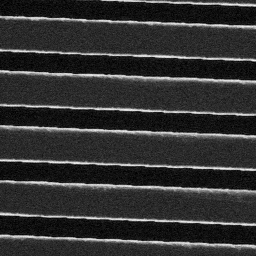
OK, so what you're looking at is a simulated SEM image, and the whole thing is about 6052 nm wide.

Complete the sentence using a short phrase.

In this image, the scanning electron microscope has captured lines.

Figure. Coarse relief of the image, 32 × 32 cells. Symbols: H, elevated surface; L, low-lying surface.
LLLLLLLLLLLLLLLLLLLLLLLLLLLLHHHH
LLLLLLLLLLLLLLLLLLLLLLLLLLLLLLLL
HHHHHHHHHHHLLLLLLLLLLLLLLLLLLLLL
HHHHHHHHHHHHHHHHHHHHHHHHHHHHHHHH
HHHHHHHHHHHHHHHHHHHHHHHHHHHHHHHH
HHHHHHHHHHHHHHHHHHHHHHHHHHHHHHHH
LLLLLHHHHHHHHHHHHHHHHHHHHHHHHHHH
LLLLLLLLLLLLLLLLLLLLLLLLLLLLLLLL
LLLLLLLLLLLLLLLLLLLLLLLLLLLLLLLL
HHHHHHHHHHHHHHHLLLLLLLLLLLLLLLLL
HHHHHHHHHHHHHHHHHHHHHHHHHHHHHHHH
HHHHHHHHHHHHHHHHHHHHHHHHHHHHHHHH
HHHHHHHHHHHHHHHHHHHHHHHHHHHHHHHH
LLLLLLLLLHHHHHHHHHHHHHHHHHHHHHHH
LLLLLLLLLLLLLLLLLLLLLLLLLLLLLLLL
LLLLLLLLLLLLLLLLLLLLLLLLLLLLLLLL
HHHHHHHHHHHHHHHHHHLLLLLLLLLLLLLL
HHHHHHHHHHHHHHHHHHHHHHHHHHHHHHHH
HHHHHHHHHHHHHHHHHHHHHHHHHHHHHHHH
HHHHHHHHHHHHHHHHHHHHHHHHHHHHHHHH
LLLLLLLLLLLLLHHHHHHHHHHHHHHHHHHH
LLLLLLLLLLLLLLLLLLLLLLLLLLLLLLLL
LLLLLLLLLLLLLLLLLLLLLLLLLLLLLLLL
HHHHHHHHHHHHHHHHHHHHHLLLLLLLLLLL
HHHHHHHHHHHHHHHHHHHHHHHHHHHHHHHH
HHHHHHHHHHHHHHHHHHHHHHHHHHHHHHHH
HHHHHHHHHHHHHHHHHHHHHHHHHHHHHHHH
LLLLLLLLLLLLLLLLLLHHHHHHHHHHHHHH
LLLLLLLLLLLLLLLLLLLLLLLLLLLLLLLL
LLLLLLLLLLLLLLLLLLLLLLLLLLLLLLLL
HHHHHHHHHHHHHHHHHHHHHHHHHHLLLLLL
HHHHHHHHHHHHHHHHHHHHHHHHHHHHHHHH